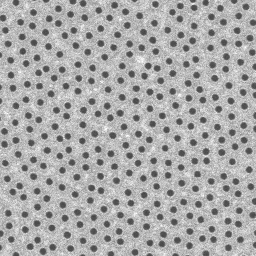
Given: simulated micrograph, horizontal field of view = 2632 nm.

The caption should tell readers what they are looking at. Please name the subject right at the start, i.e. a regular array of holes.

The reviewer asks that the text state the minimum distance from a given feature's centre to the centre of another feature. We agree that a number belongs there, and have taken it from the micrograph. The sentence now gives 132 nanometres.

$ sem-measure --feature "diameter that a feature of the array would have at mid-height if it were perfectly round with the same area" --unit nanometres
68.6